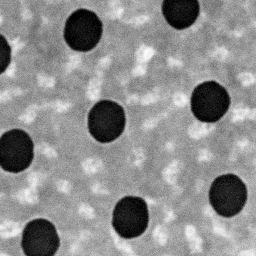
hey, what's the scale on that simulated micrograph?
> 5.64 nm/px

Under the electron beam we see holes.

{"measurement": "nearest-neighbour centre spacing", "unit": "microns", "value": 0.538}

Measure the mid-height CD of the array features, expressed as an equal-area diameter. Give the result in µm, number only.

0.238